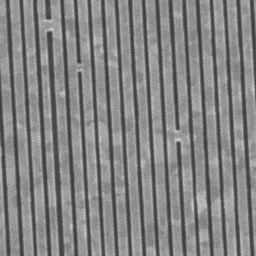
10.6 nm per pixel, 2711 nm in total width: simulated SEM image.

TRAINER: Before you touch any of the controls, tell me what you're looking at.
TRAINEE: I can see parallel lines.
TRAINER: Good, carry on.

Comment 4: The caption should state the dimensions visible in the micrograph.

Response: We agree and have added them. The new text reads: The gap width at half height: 54.2 nm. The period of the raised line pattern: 143 nanometers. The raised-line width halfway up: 0.0899 µm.